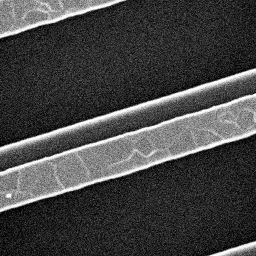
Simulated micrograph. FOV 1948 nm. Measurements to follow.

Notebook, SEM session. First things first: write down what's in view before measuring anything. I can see lines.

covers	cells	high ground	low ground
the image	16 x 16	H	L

HHHHHHLLLLLLLLLL
HHHLLLLLLLLLLLLL
LLLLLLLLLLLLLLLL
LLLLLLLLLLLLLLLL
LLLLLLLLLLLLLLLH
LLLLLLLLLLLLHHHH
LLLLLLLLLHHHHHHH
LLLLLLHHHHHHHHHH
LLHHHHHHHHHHHHHL
HHHHHHHHHHHHLLLL
HHHHHHHHHLLLLLLL
HHHHHHLLLLLLLLLL
HHLLLLLLLLLLLLLL
LLLLLLLLLLLLLLLL
LLLLLLLLLLLLLLLL
LLLLLLLLLLLLLLLH